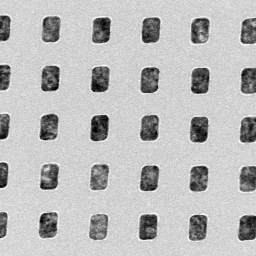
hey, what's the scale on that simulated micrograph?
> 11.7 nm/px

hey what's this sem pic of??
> a regular array of holes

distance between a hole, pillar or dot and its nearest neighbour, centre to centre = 0.571 microns